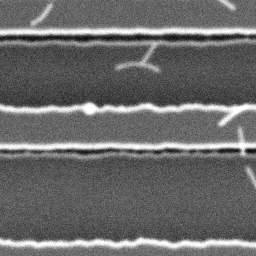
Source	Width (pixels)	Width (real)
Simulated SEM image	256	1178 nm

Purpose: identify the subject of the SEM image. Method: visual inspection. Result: lines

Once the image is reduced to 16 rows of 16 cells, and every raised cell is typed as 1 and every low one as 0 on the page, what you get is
1111111111111111
1111111111111111
0000000000000000
0000000000000000
0000000000000000
0000000000000000
0000000000000000
1111111111111111
1111111111111111
0000000000000000
0000000000000000
0000000000000000
0000000000000000
0000000000000000
0000000000000000
1111111111111111